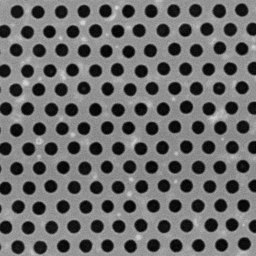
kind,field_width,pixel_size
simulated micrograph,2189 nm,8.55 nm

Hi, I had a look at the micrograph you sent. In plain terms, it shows a regular array of holes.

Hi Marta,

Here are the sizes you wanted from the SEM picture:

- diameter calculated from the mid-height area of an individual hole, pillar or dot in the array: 114 nanometres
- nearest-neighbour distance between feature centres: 0.186 µm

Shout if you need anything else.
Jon